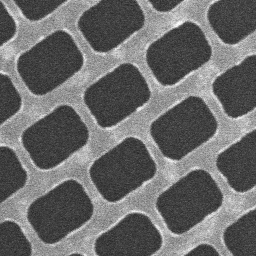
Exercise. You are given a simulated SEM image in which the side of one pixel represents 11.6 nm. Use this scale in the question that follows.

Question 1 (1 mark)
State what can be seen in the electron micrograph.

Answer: a regular array of holes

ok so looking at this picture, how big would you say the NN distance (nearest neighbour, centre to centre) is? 860 nanometers